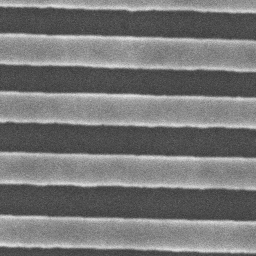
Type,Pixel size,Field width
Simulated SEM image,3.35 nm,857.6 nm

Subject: lines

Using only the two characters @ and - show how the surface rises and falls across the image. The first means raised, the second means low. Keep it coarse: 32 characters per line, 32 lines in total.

@@@@@@@@@@@@@@@@@@@@@@@@@@@@@@@@
-----------------------------@-@
--------------------------------
--------------------------------
@@@@@---------------------------
@@@@@@@@@@@@@@@@@@@@@@@@@@@@@@@@
@@@@@@@@@@@@@@@@@@@@@@@@@@@@@@@@
@@@@@@@@@@@@@@@@@@@@@@@@@@@@@@@@
------------------@-@@@@@@@@@@@@
--------------------------------
--------------------------------
--------------------------------
@@@@@@@@@@@@@@@@@@@@@@@@@@@@@@@@
@@@@@@@@@@@@@@@@@@@@@@@@@@@@@@@@
@@@@@@@@@@@@@@@@@@@@@@@@@@@@@@@@
--------------@@@@@@@@@@@@@@@@@@
--------------------------------
--------------------------------
--------------------------------
@@@@@@@@@@@@--@-----------------
@@@@@@@@@@@@@@@@@@@@@@@@@@@@@@@@
@@@@@@@@@@@@@@@@@@@@@@@@@@@@@@@@
@@@@@@@@@@@@@@@@@@@@@@@@@@@@@@@@
-----------------------------@@@
--------------------------------
--------------------------------
--------------------------------
@@@@@@@@@@@@@@@@----------------
@@@@@@@@@@@@@@@@@@@@@@@@@@@@@@@@
@@@@@@@@@@@@@@@@@@@@@@@@@@@@@@@@
@@@@@@@@@@@@@@@@@@@@@@@@@@@@@@@@
--------------------------------